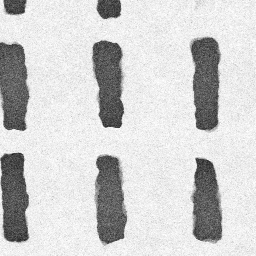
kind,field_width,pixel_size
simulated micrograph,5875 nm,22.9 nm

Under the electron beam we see holes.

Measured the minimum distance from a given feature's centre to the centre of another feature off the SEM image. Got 2.23 micrometres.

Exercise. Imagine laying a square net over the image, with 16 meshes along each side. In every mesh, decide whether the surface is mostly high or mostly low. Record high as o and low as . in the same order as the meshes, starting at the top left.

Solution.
.ooooo..oooooooo
oooooooooooooooo
oooooooooooo.ooo
..oooo..oooo..oo
..oooo..oooo..oo
..oooo..oooo..oo
..oooo..oooo..oo
..oooo..oooo..oo
oooooooooooooooo
oooooooooooooooo
.ooooo..oooo.ooo
..oooo..oooo..oo
..oooo..oooo..oo
..oooo..oooo..oo
..oooo..oooo..oo
oooooooooooooooo